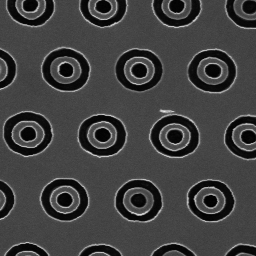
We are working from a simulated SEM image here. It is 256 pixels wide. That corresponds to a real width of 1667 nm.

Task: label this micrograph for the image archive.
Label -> a regular array of ring-shaped grooves with a dot in the middle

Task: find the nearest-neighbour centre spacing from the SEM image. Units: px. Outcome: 72.9